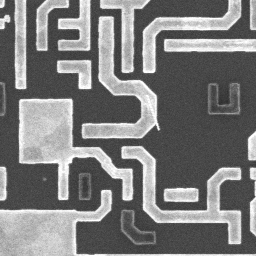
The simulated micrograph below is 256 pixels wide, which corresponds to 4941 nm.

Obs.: wiring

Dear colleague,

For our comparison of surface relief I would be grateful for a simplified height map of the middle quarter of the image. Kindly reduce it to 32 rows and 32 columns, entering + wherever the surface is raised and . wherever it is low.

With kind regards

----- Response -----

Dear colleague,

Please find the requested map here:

+++++++..+++...++...+++.........
+++++++..+++...++...+++.........
....+++..+++....................
....+++..++++...................
....+++..+++++++++++............
....+++...+++++++++++...........
...........+++++++++++..........
............+++++++++++.........
...................++++.........
++.................++++.........
++.................++++.........
++.................++++.........
++.................++++.........
++.................++++.........
++................+++++.........
++...+++++++++++++++++..........
++...+++++++++++++++++..........
++...+++++++++++++++............
++..............................
++..............................
++..............................
+++++++++......+++++............
++++++++++.....++++++...........
++......+++.......++++..........
++.......+++.......++++.........
+........+++........+++.........
+.........+++++++...+++.........
+...++.....++++++...+++.........
+...++........+++...+++.........
+...++.........++...+++.........
+...+++........++...+++.........
+...+++........++...+++..+++++++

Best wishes